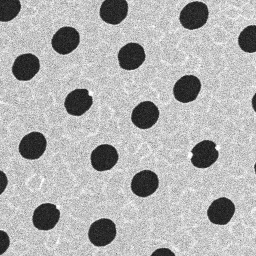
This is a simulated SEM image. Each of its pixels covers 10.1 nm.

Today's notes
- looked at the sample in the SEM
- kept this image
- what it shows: a regular array of holes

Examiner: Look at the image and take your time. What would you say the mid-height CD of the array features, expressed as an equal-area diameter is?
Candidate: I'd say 0.28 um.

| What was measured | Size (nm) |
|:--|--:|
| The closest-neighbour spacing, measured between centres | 594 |